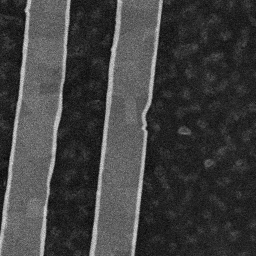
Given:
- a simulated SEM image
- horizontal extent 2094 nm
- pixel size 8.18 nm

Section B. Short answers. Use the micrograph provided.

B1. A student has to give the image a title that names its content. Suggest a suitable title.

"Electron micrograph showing one or a few lines or trenches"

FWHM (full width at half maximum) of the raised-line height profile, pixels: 41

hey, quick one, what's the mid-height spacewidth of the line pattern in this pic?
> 0.405 um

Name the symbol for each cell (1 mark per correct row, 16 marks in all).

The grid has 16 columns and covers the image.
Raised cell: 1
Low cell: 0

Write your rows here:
0011000111000000
0011000111000000
0011000111000000
0011000111000000
0111000111000000
0111000110000000
0111000110000000
0111000110000000
0110000110000000
0110001110000000
0110001110000000
0110001110000000
1110001110000000
1110001110000000
1110001100000000
1110001100000000